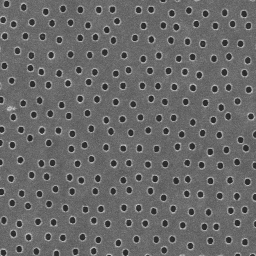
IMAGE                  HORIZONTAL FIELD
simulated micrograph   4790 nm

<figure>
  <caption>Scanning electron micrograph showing a regular array of holes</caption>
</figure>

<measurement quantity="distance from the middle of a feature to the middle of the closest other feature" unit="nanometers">272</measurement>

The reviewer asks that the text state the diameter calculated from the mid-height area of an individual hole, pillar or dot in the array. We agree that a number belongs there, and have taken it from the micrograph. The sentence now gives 120 nanometers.